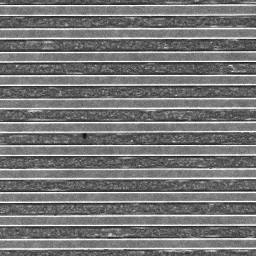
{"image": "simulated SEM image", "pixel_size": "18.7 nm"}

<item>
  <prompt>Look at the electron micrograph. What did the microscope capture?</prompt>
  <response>parallel lines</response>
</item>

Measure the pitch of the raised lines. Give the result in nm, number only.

437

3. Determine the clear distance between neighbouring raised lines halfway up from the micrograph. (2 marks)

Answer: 12.9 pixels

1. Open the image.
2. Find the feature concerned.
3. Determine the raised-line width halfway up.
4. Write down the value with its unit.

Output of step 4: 185 nm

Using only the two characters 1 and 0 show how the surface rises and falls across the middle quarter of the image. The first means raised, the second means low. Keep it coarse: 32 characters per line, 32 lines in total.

00000000000000000000000000000000
00000000000000000000000000000000
00000000000000000000000000000000
11111111111111111111111111111111
11111111111111111111111111111111
00000000000000000000000000000000
00000000000000000000000000000000
00000000000000000000000000000000
00000000000000000000000000000000
11111111111111111111111111111111
11111111111111111111111111111111
00000000000000000000000000000000
00000000000000000000000000000000
00000000000000000000000000000000
00000000000000000000000000000000
11111111111111111111111111111111
11111111111111111111111111111111
00000000000000000000000000000000
00000000000000000000000000000000
00000000000000000000000000000000
11111111111111111111111111111111
11111111111111111111111111111111
11111111111111111111111111111111
00000000000000000000000000000000
00000000000000000000000000000000
00000000000000000000000000000000
11111111111111111111111111111111
11111111111111111111111111111111
11111111111111111111111111111111
00000000000000000000000000000000
00000000000000000000000000000000
00000000000000000000000000000000